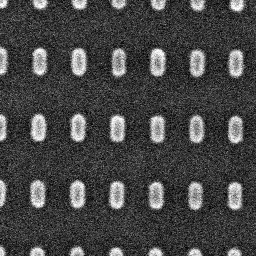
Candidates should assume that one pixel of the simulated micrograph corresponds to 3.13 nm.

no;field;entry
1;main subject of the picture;a regular array of raised bodies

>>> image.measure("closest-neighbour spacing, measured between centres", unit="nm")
122